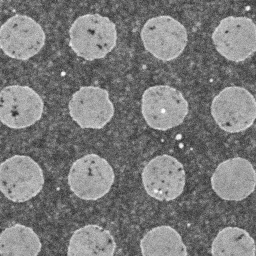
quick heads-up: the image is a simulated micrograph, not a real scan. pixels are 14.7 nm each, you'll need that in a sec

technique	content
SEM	raised bodies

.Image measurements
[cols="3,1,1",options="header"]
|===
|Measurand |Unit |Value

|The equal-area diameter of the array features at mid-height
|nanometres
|648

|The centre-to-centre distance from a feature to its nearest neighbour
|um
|1.03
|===